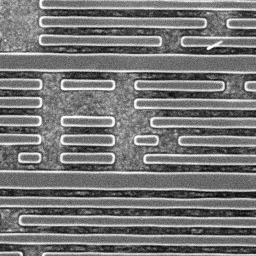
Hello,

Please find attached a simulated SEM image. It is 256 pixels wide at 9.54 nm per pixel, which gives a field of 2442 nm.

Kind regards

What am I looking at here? groups of lines, slits or small figures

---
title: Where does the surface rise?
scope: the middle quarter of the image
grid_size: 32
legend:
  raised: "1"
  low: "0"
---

11111111111111111111111111111111
11111111111111111111111111111111
00000000000000000000000000000000
00000000000000000000000000000000
11111111111110000011111111111111
11111111111110000011111111111111
00000000000000000000000000000011
00000000000000000000000000000000
00000000000000000000000000000000
00000000000000000011111111111111
00000000000000000011111111111111
00000000000000000000000000000000
00000000000000000000000000000000
11111111111100000000001111111111
11111111111100000000001111111111
00001111111100000000001111111111
00000000000000000000000000000000
00000000000000000000000000000000
11111111111110000011111000000111
11111111111110000011111000000111
00000000000000000000000000000000
00000000000000000000000000000000
11111111111100000000000000000000
11111111111110000000111111111111
11111111111100000000111111111111
00000000000000000000000000000000
00000000000000000000000000000000
11111111111111111111111111111111
11111111111111111111111111111111
11111111111111111111111111111111
11111111111111111111111111111111
00000000000000000000000000000000